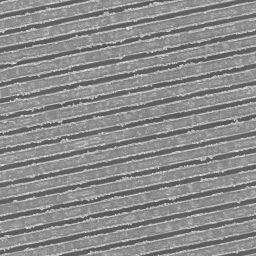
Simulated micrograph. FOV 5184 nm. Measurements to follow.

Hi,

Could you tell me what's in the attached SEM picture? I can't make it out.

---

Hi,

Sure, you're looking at parallel lines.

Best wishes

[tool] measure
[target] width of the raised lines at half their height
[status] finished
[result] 236 nanometres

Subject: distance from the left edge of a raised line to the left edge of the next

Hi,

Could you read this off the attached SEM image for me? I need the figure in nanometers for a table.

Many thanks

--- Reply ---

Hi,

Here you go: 334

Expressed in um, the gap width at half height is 0.0968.